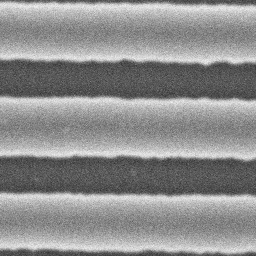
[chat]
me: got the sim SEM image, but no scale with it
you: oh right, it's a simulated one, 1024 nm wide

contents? lines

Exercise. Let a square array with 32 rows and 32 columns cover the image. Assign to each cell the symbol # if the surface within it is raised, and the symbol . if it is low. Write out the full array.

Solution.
###########.#..#...#............
################################
################################
################################
################################
################################
################################
......#.###.###.################
................................
................................
................................
................................
################.###.###.#......
################################
################################
################################
################################
################################
################################
#...#####..####.################
................................
................................
................................
................................
#####################.#########.
################################
################################
################################
################################
################################
################################
............................##..